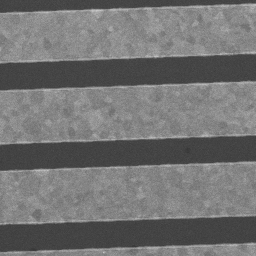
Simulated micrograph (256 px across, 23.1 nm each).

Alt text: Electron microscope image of lines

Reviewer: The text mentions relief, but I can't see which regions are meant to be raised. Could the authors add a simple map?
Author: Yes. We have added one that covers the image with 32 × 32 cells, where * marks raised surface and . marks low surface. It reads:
................................
.....***************************
********************************
********************************
********************************
********************************
********************************
**********......................
................................
................................
.........................*******
********************************
********************************
********************************
********************************
********************************
********************************
*************...................
................................
................................
.........................*******
********************************
********************************
********************************
********************************
********************************
********************************
**************..................
................................
................................
................................
..******************************